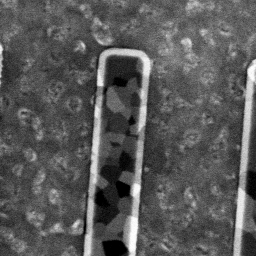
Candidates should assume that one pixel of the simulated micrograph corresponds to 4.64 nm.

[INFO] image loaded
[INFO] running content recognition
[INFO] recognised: one or a few lines or trenches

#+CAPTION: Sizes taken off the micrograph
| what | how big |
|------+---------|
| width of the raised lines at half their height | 44.1 pixels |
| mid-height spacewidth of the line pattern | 489 nm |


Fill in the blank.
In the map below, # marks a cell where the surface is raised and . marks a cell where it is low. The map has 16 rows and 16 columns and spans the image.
................
................
................
.......##.......
......###.......
......###.......
......###.......
......###......#
......###......#
......###......#
......###......#
......###......#
......##.......#
......##.......#
......##.......#
.....###.......#